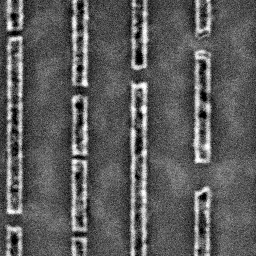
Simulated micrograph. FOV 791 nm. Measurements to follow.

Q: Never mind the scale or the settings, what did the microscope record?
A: one or a few lines or trenches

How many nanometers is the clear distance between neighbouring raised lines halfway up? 158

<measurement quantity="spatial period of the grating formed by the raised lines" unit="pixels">62.3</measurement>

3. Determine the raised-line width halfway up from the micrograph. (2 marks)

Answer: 37.8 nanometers